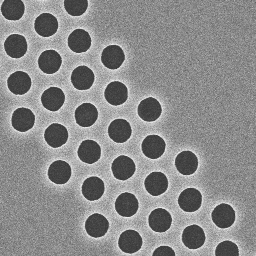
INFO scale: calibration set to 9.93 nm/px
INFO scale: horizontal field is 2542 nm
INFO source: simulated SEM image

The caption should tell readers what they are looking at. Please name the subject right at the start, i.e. a regular array of holes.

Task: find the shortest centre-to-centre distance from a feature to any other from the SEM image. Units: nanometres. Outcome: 362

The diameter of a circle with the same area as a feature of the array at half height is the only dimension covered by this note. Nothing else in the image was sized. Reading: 240 nanometers